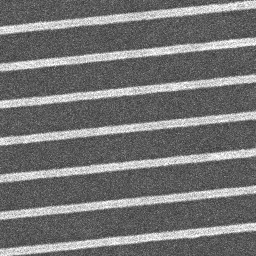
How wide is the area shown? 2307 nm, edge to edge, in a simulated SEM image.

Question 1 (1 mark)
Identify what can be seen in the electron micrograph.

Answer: parallel lines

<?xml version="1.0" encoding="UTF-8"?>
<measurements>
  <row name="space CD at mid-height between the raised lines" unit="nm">269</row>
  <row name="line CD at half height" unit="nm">59.4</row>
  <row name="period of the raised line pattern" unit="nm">332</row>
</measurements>